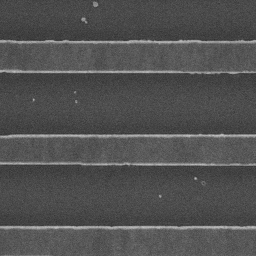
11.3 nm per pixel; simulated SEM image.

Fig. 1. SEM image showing lines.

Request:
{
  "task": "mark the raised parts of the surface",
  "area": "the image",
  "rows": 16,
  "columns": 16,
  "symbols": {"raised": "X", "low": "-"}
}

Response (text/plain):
----------------
----------------
----------------
XXXXXXXXXXXXXXXX
--XXXXXXXXXXXXXX
----------------
----------------
----------------
XXXXXXXXXXXXXXXX
XXXXXXXXXXXXXXXX
----------------
----------------
----------------
----------------
XXXXXXXXXXXXXXXX
XXXXXXXXXXXXXXXX